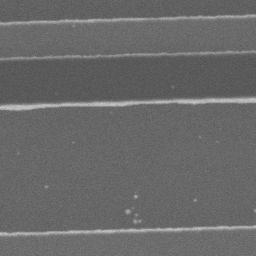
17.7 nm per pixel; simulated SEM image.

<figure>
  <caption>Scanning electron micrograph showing lines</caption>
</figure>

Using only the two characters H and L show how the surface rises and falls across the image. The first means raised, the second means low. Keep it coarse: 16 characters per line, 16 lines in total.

LLLLLLLLLLLLLLLL
HHHHHHHHHHHHHHHH
HHHHHHHHHHHHHHHH
HHHHHHHHHHHHHHHH
HHHHHHHHHHHHHHHH
HHHHHHHHHHHHHHHH
HHHHLLLLLLLLLLLL
LLLLLLLLLLLLLLLL
LLLLLLLLLLLLLLLL
LLLLLLLLLLLLLLLL
LLLLLLLLLLLLLLLL
LLLLLLLLLLLLLLLL
LLLLLLLLLLLLLLLL
LLLLLLLLLLLLLLLL
LLLLLHHHHHHHHHHH
HHHHHHHHHHHHHHHH